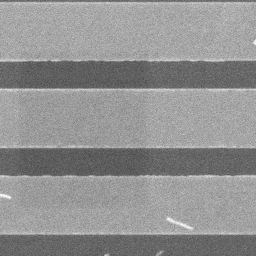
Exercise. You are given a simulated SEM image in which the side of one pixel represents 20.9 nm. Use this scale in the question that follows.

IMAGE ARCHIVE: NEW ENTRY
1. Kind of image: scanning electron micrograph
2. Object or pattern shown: lines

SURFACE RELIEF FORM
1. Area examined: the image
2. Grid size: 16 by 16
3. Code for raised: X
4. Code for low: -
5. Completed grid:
XXXXXXXXXXXXXXXX
XXXXXXXXXXXXXXXX
XXXXXXXXXXXXXXXX
XXXXXXXXXXXXXXXX
----------------
----------------
XXXXXXXXXXXXXXXX
XXXXXXXXXXXXXXXX
XXXXXXXXXXXXXXXX
----------------
----------------
XXXXXXXXXXXXXXXX
XXXXXXXXXXXXXXXX
XXXXXXXXXXXXXXXX
XXXXXXXXXXXXXXXX
----------------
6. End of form